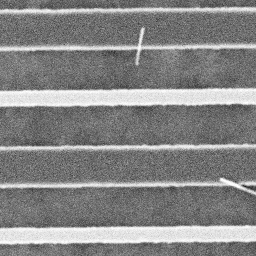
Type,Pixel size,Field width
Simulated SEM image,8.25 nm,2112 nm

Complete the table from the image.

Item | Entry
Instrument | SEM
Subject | lines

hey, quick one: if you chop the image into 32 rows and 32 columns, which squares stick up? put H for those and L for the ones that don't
LLLLLLLLLLLLLLLLLLLLLLLLLLLLLLLL
HHHHHHHHHHHHHHHHHHHHHHHHHHHHHHHH
HHHHHHHHHHHHHHHHHHHHHHHHHHHHHHHH
HHHHHHHHHHHHHHHHHHHHHHHHHHHHHHHH
HHHHHHHHHHHHHHHHHHHHHHHHHHHHHHHH
HHHHHHHHHHHHHHHHHHHHHHHHHHHHHHHH
LLLLLLLLLLLLLLLLLLLLLLLLLLLLLLLL
LLLLLLLLLLLLLLLLLLLLLLLLLLLLLLLL
LLLLLLLLLLLLLLLLLLLLLLLLLLLLLLLL
LLLLLLLLLLLLLLLLLLLLLLLLLLLLLLLL
LLLLLLLLLLLLLLLLLLLLLLLLLLLLLLLL
HHHHHHHHHHHHHHHHHHHHHHHHHHHHHHHH
HHHHHHHHHHHHHHHHHHHHHHHHHHHHHHHH
LLLLLLLLLLLLLLLLLLLLLLLLLLLLLLLL
LLLLLLLLLLLLLLLLLLLLLLLLLLLLLLLL
LLLLLLLLLLLLLLLLLLLLLLLLLLLLLLLL
LLLLLLLLLLLLLLLLLLLLLLLLLLLLLLLL
LLLLLLLLLLLLLLLLLLLLLLLLLLLLLLLL
HHHHHHHHHHHHHHHHHHHHHHHHHHHHHHHH
HHHHHHHHHHHHHHHHHHHHHHHHHHHHHHHH
HHHHHHHHHHHHHHHHHHHHHHHHHHHHHHHH
HHHHHHHHHHHHHHHHHHHHHHHHHHHHHHHH
HHHHHHHHHHHHHHHHHHHHHHHHHHHHHHHH
LLLLLLLLLLLLLLLLLLLLLLLLLLLLLLLL
LLLLLLLLLLLLLLLLLLLLLLLLLLLLLLLL
LLLLLLLLLLLLLLLLLLLLLLLLLLLLLLLL
LLLLLLLLLLLLLLLLLLLLLLLLLLLLLLLL
LLLLLLLLLLLLLLLLLLLLLLLLLLLLLLLL
LLLLLLLLLLLHHLHHHHHHHHHHHHHHHHHH
HHHHHHHHHHHHHHHHHHHHHHHHHHHHHHHH
LLLLLLLLLLLLLLLLLLLLLLLLLLLLLLLL
LLLLLLLLLLLLLLLLLLLLLLLLLLLLLLLL